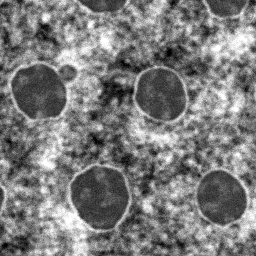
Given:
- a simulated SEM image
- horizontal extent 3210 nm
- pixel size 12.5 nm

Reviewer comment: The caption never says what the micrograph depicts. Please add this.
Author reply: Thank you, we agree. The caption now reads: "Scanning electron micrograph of raised bodies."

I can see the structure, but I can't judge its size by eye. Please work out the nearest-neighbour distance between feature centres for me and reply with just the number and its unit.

1490 nanometers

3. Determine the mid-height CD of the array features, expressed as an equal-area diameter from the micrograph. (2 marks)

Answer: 0.721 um